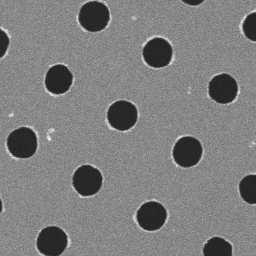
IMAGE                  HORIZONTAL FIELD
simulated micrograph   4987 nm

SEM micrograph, a regular array of holes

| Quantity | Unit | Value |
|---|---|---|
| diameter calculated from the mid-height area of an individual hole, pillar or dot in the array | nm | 588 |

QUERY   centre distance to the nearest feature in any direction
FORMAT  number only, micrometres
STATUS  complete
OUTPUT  1.41